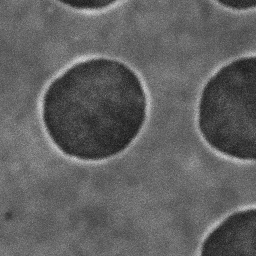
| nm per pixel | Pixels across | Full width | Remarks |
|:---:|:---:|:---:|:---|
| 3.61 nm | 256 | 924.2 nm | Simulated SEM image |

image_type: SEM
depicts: holes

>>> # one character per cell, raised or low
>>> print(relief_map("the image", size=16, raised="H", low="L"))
HHHHHLLHHHHHHHLL
HHHHHHHHHHHHHHHH
HHHHHHHHHHHHHHHH
HHHHHHHHHHHHHHHH
HHHHLLLLHHHHHLLL
HHHLLLLLLHHHHLLL
HHHLLLLLLHHHLLLL
HHHLLLLLLHHHLLLL
HHHLLLLLHHHHHLLL
HHHHLLLLHHHHHHLL
HHHHHHHHHHHHHHHH
HHHHHHHHHHHHHHHH
HHHHHHHHHHHHHHHH
HHHHHHHHHHHHHHLL
HHHHHHHHHHHHHLLL
HHHHHHHHHHHHHLLL